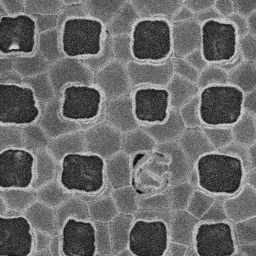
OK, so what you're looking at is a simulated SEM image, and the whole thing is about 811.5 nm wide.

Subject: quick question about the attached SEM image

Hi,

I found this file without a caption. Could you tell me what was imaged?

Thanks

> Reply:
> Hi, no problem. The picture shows a regular array of holes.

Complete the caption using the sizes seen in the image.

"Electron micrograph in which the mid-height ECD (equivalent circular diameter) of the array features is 0.135 um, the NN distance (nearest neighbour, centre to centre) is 209 nm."